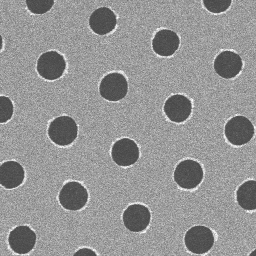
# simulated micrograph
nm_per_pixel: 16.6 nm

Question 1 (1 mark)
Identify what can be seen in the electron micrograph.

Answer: a regular array of holes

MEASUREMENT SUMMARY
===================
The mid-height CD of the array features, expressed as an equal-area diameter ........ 0.471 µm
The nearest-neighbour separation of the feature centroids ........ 1.1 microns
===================